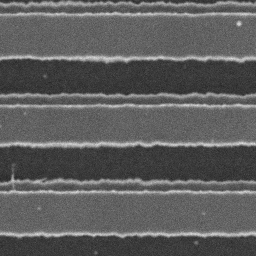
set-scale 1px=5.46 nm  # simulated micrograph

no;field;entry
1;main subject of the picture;lines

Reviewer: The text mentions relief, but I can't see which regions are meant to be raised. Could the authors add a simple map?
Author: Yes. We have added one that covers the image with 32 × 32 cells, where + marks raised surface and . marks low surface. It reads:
+++..+.+++++++++++++++.++..+++++
++++++++++++++++++++++++++++++++
++++++++++++++++++++++++++++++++
++++++++++++++++++++++++++++++++
++++++++++++++++++++++++++++++++
++++++++++++++++++++++++++++++++
++++++++++++++++++++++++++++++++
................................
................................
................................
................................
................................
++++++++++++++++++++++++++++++++
++++++++++++++++++++++++++++++++
++++++++++++++++++++++++++++++++
++++++++++++++++++++++++++++++++
++++++++++++++++++++++++++++++++
++++++++++++++++++++++++++++++++
................................
................................
................................
................................
................................
++++++++++++++++++++++++++++++++
++++++++++++++++++++++++++++++++
++++++++++++++++++++++++++++++++
++++++++++++++++++++++++++++++++
++++++++++++++++++++++++++++++++
++++++++++++++++++++++++++++++++
...............+................
................................
................................